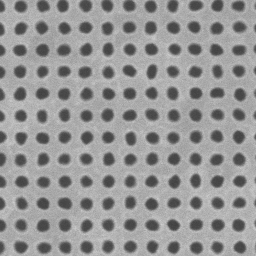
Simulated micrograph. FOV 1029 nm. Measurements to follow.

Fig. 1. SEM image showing a regular array of holes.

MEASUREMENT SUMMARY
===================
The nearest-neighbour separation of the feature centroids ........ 21.2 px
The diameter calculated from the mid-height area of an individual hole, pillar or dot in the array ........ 52.5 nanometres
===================